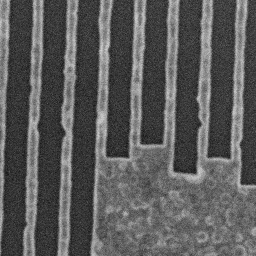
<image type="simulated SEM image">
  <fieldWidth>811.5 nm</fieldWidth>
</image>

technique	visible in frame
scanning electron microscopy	parallel lines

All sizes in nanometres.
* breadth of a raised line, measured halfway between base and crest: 30.9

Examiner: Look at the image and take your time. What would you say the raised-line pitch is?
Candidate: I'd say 107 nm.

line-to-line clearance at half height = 76.1 nm